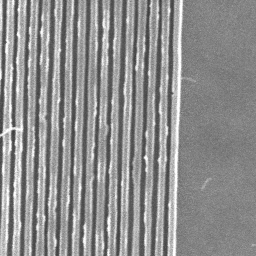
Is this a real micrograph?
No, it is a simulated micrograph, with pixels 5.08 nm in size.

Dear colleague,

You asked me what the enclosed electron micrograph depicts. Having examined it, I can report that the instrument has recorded parallel lines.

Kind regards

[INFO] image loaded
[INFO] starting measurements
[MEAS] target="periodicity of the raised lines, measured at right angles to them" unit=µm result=0.0607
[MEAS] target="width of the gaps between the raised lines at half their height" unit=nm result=27.9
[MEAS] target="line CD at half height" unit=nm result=33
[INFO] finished